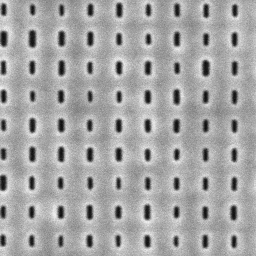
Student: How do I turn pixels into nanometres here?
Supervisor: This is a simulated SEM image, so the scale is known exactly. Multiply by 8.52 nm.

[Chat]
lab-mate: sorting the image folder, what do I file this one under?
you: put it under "a regular array of holes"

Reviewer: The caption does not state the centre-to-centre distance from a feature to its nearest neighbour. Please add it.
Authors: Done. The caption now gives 242 nm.